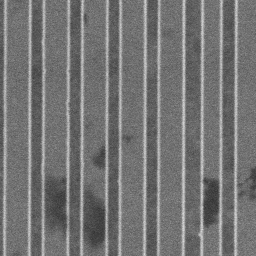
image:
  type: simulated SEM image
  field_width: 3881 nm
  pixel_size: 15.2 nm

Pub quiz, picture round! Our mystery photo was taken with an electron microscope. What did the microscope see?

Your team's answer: parallel lines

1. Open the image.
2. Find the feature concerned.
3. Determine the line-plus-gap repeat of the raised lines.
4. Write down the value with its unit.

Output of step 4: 589 nm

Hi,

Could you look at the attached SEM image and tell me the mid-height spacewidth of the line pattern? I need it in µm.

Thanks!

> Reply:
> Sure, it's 0.205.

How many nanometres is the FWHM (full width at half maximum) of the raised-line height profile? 385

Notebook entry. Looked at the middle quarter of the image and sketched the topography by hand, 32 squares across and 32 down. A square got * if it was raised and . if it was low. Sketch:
*....******...******....******..
*....******...******....******..
*....******...******....******..
*....******...******....******..
*....******...******....******..
*....******...******....******..
*....******...******....******..
*....******...******....******..
*....******...******....******..
*....******...******....******..
*....******...******....******..
*....******...******....******..
*....******...******....******..
*....******...******....******..
*....******...******....******..
*....******...******....******..
*....******...******....******..
*....******...******....******..
*....******...******....******..
*....******...******....******..
*....******...******....******..
*....******...******....******..
*....*****....******....******..
*....*****....******....******..
*....*****....******....******..
*....*****....******....******..
*....*****....******....******..
*....*****....******....******..
*....*****....******....******..
*....*****....******....******..
*....*****....******....******..
*....*****....******....******..